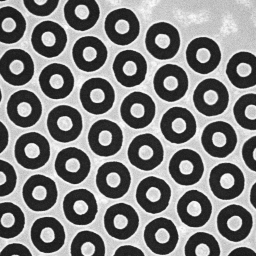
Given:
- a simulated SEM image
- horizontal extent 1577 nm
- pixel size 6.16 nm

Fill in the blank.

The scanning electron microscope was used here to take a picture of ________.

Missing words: a regular array of ring-shaped grooves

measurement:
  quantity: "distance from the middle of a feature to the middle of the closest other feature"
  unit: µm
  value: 0.261